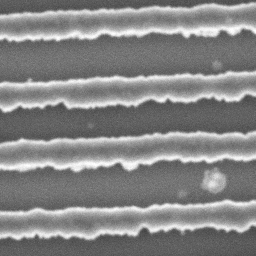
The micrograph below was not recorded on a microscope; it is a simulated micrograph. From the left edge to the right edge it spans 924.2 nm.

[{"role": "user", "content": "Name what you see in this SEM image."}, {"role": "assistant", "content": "lines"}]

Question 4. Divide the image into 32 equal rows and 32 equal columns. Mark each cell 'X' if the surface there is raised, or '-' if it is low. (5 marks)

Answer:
-------------------------------X
------XXXXXXXXXXXXXXXXXXXXXXXXXX
XXXXXXXXXXXXXXXXXXXXXXXXXXXXXXXX
XXXXXXXXXXXXXXXXXXXXXXXXXXXXXXXX
XXXXXXXXX-XX--------------------
--------------------------------
--------------------------------
--------------------------------
--------------------------------
----------------------XXX--XXXXX
XXXXXXXXXXXXXXXXXXXXXXXXXXXXXXXX
XXXXXXXXXXXXXXXXXXXXXXXXXXXXXXXX
XXXXXXXXXXXXXXXXXX--XXXXX---XX--
XX------------------------------
--------------------------------
--------------------------------
-------------------------------X
--XX---XXXXXXXXXXXXXXXXXXXXXXXXX
XXXXXXXXXXXXXXXXXXXXXXXXXXXXXXXX
XXXXXXXXXXXXXXXXXXXXXXXXXXXXXXXX
XXXXXXXXXXXXXX--X---------------
--------------------------------
--------------------------------
--------------------------------
--------------------------------
--------------------------XXXXXX
---XXXXXXXXXXXXXXXXXXXXXXXXXXXXX
XXXXXXXXXXXXXXXXXXXXXXXXXXXXXXXX
XXXXXXXXXXXXXXXXXXXXX-XXX--XXXX-
XXXX-XX-X-XX--------------------
--------------------------------
--------------------------------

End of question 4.